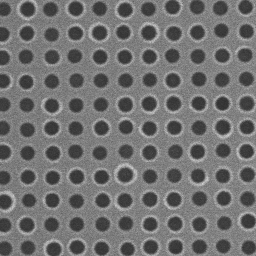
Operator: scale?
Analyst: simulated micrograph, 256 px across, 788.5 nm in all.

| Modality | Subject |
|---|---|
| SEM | a regular array of holes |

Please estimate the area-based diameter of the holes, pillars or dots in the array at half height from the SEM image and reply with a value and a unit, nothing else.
43.8 nm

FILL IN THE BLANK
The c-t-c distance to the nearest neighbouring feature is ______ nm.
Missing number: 71.3